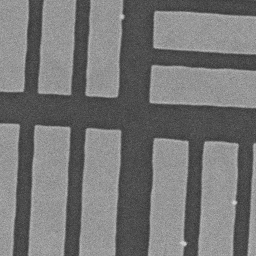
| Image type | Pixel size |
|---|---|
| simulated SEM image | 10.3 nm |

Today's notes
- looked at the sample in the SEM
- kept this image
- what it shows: groups of lines, slits or small figures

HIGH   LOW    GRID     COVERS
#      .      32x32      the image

###..####..####.................
####.####..####.....#...........
###..####..####....#############
###..####..####....#############
###..####..####....#############
###..####..####....#############
###..####..####............#####
###..####..####.................
###..####..####....#####........
###..####..####....#############
###..####..####....#############
.....####..####....#############
...................#############
................................
................................
................................
##..#####..####.................
##..#####..####.....##..........
##..#####..####....####..#####..
##..#####..####....####..#####..
##..####...####....####..#####..
##..####..#####....####..#####..
##..####..#####....####..#####..
##..####..#####....####..#####.#
##..####..#####....####..####..#
##..####..#####....####..####..#
##..####..#####....####..####..#
##..####..####.....####..####..#
##..####..####.....####..####..#
##..####..####.....####..####..#
##..####..####.....####..####..#
##..####..####.....####..####..#